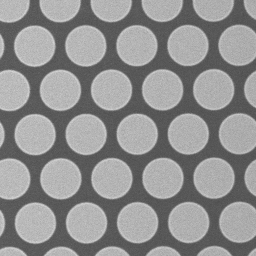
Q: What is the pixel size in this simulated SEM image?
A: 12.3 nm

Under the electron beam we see an array of small figures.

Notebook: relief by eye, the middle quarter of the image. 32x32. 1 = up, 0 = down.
00000000000000000000000000000000
00000000000000000000000000000000
11000000011111100000011111110000
11100000111111110000011111111000
11110001111111110000111111111000
11110001111111111000111111111100
11110001111111111000111111111100
11110001111111111000111111111100
11110001111111110000111111111000
11100000111111110000111111111000
11000000011111100000001111110000
10000000000000000000000000000000
00000000000000000000000000000000
00011111000000011111100000001111
00111111110000111111110000011111
01111111110000111111111000111111
01111111111001111111111000111111
01111111111001111111111000111111
01111111111001111111111000111111
01111111110000111111111000111111
01111111110000111111110000011111
00111111100000011111110000001111
00001110000000000111000000000000
00000000000000000000000000000000
11000000011111100000001111110000
11100000111111110000011111111000
11110001111111110000111111111000
11110001111111111000111111111100
11110001111111111000111111111100
11110001111111111000111111111100
11110001111111111000111111111000
11110000111111110000011111111000